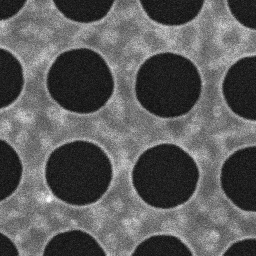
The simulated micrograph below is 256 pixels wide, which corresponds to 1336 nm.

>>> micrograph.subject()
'holes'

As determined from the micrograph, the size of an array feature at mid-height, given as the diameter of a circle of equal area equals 348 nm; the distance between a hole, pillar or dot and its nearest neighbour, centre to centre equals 455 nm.